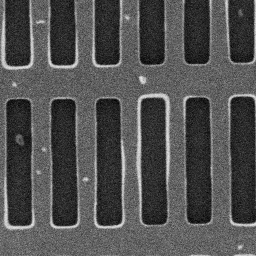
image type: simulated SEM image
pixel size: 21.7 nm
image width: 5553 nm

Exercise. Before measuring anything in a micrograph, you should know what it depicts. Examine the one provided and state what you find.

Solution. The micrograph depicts groups of lines, slits or small figures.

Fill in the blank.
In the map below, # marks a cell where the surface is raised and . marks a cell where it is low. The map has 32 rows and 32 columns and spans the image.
....##...###...##....##...##....
....##...###...##....##...##....
....##...###...##....##...##....
....##....##...##....##...##....
....##....##...##....##...##....
....##....##...##....##...###...
....##....##...##....##...###...
....##....##...##....##...###...
################################
################################
################################
################################
#..####..###...###...##...###...
#...##....##...##....##...###...
#...##....##...##....##...###...
#...##....##...##....##...###...
#...##....##...##....##...###...
#.#.##....##...##....##...###...
#...##....##...##....##...###...
#...##....##...##....##...###...
#...##....##...##....##...###...
#...##....##...##....##...###...
#...##....##...##....##...###...
#...##....##...##....##...###...
#...##....##...##....##....##...
#...##....##...##....##....##...
#...##....##...##....##....##...
#...##....##...###...##...###...
################################
################################
################################
################################